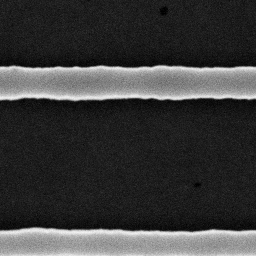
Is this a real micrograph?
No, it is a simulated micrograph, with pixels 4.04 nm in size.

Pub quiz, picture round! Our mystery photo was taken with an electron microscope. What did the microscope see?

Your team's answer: lines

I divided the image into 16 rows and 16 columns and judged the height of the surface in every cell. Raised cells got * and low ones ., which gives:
................
................
................
................
****************
****************
................
................
................
................
................
................
................
................
**********..****
****************